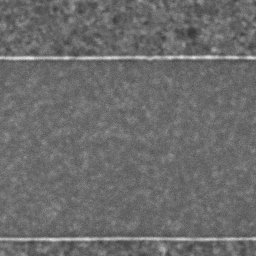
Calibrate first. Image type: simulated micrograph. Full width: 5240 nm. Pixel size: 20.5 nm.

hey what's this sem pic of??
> one or a few lines or trenches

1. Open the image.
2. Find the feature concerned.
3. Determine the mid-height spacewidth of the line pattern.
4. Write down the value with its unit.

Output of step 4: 3.72 microns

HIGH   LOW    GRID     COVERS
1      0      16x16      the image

1111111111111111
1111111111111111
1111111111111111
1111111111111111
0000000000000000
0000000000000000
0000000000000000
0000000000000000
0000000000000000
0000000000000000
0000000000000000
0000000000000000
0000000000000000
0000000000000000
0000000000000000
1111111111111111